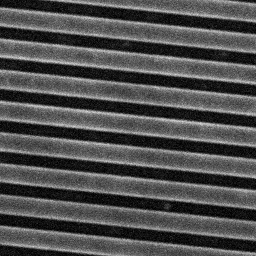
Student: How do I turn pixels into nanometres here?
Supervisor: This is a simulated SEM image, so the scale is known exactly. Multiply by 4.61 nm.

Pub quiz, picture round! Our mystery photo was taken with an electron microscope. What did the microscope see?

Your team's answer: parallel lines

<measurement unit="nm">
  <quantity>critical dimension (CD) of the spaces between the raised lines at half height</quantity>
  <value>63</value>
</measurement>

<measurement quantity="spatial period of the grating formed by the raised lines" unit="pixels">31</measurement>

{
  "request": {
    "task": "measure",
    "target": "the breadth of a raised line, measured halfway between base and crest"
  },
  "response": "0.0813 µm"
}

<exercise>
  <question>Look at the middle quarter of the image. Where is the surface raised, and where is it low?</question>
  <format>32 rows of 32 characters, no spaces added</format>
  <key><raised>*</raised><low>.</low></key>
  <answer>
.......*************************
.................***************
..........................******
**..............................
***********.....................
********************............
******************************..
********************************
........************************
..................**************
...........................*****
***.............................
************....................
*********************...........
*******************************.
********************************
.........***********************
...................*************
............................****
******..........................
***************.................
*************************.......
********************************
...*****************************
.............*******************
....................*.**********
...............................*
*******.........................
****************................
**************************......
********************************
....****************************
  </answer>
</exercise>